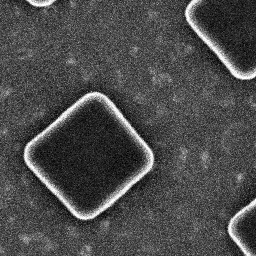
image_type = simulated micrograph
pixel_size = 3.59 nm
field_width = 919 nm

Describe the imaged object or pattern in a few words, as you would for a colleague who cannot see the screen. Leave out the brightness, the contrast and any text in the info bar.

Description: raised bodies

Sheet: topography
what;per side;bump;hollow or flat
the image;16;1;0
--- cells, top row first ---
0000000000001111
0000000000001111
0000000000000111
0000000000000011
0000000000000001
0000000000000000
0000011000000000
0000111100000000
0011111110000000
0011111110000000
0011111110000000
0001111100000000
0000111000000000
0000010000000001
0000000000000011
0000000000000001